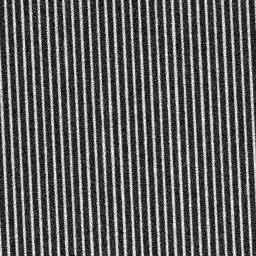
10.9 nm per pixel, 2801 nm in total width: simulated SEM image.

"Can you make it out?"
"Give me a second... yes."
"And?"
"parallel lines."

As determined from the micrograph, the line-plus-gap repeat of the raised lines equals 91.3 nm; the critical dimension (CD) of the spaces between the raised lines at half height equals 62.9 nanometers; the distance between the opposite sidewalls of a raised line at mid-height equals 21.9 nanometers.